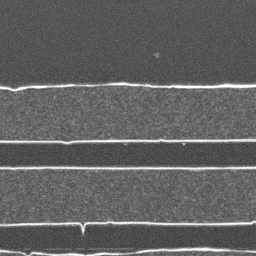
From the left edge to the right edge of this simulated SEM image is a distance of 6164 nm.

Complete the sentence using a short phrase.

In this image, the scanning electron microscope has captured one or a few lines or trenches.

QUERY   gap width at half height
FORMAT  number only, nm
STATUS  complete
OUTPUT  668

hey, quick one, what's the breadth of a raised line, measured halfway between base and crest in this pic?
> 1340 nm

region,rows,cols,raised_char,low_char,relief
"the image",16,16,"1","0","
0000000000000000
0000000000000000
0000000000000000
0000000000000000
0000000000000000
0011111111111111
1111111111111111
1111111111111111
1111111111111111
0000000000000000
0000000000000000
1111111111111111
1111111111111111
1111111111111111
0000000000000000
0000000000000000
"